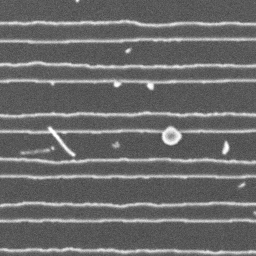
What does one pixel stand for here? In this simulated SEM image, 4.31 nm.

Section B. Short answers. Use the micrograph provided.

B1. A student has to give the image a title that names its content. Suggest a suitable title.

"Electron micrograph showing lines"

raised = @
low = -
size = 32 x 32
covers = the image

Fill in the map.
--------------------------------
--------------------------------
--------------------------------
@@@@@@@@@@@@@@@@@@@@@@@@@@@@@@@@
@@@@@@@@@@@@@@@@@@@@@@@@@@@@@@@@
--------------------------------
--------------------------------
--------------------------------
@@@@@@@@@@@@@@@@@@@@@@@@@@@@@@@@
@@@@@@@@@@@@@@@@@@@@@@@@@@@@@@@@
--------------@---@-------------
--------------------------------
--------------------------------
--------------------------------
@@@@@@@@@@@@@@@@@@@@@@@@@@@@@@@@
@@@@@@@@@@@@@@@@@@@@@@@@@@@@@@@@
---@@@@@@--@@-------@@@---------
--------------------@@----------
--------------------------------
--------------------------------
@@@@@@@@@@@@@@@@@@@@@@@@@@@@@@@@
@@@@@@@@@@@@@@@@@@@@@@@@@@@@@@@@
--------------------------------
--------------------------------
--------------------------------
--@@@@@@@-@@-----@@----@@@@@@@@@
@@@@@@@@@@@@@@@@@@@@@@@@@@@@@@@@
@@@@@@@@@@@@@@@@@@@@@@@@@@@@@@@@
--------------------------------
--------------------------------
--------------------------------
@@@@@@@@@@@@@@@@@@@@@@@@@@@@@@@@